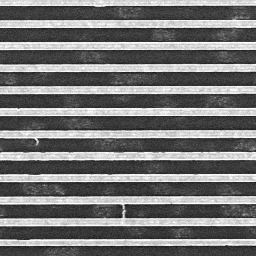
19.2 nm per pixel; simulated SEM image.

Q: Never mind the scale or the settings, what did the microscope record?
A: parallel lines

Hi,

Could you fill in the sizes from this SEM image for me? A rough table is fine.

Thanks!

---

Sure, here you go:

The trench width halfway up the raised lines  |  295 nanometers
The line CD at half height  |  139 nanometers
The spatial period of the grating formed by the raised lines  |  419 nm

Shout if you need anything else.